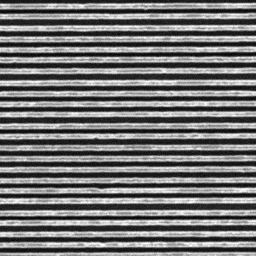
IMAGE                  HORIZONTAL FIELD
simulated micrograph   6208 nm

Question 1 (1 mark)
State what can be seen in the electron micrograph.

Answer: parallel lines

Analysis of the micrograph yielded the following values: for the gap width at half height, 0.164 um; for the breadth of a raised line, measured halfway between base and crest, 103 nm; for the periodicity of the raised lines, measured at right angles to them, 0.263 µm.